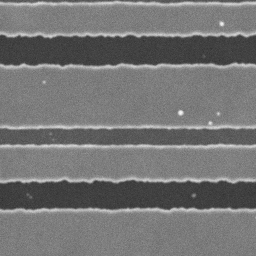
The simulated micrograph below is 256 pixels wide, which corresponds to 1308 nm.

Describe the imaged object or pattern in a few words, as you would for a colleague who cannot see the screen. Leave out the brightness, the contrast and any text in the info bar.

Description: lines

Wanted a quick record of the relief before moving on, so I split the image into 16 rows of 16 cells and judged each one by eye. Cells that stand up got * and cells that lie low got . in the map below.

****************
****************
................
................
****************
****************
****************
****************
****************
****************
****************
................
................
****************
****************
****************